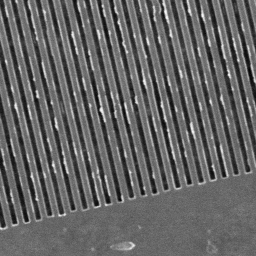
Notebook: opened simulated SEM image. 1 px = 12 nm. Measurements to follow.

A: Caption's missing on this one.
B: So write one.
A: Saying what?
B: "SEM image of parallel lines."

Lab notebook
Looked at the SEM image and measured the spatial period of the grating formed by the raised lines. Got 143 nanometres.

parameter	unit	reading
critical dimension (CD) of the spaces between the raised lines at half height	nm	59.8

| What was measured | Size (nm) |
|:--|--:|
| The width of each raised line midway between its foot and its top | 80.3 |